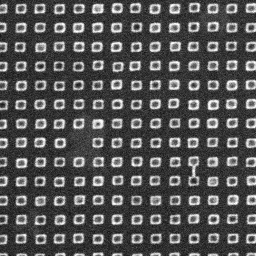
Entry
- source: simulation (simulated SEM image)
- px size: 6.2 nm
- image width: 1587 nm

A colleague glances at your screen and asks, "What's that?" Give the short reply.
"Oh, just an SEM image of a regular array of raised bodies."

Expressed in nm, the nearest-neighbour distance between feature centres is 115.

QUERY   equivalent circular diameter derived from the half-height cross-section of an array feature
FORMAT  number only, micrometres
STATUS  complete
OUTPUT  0.0614